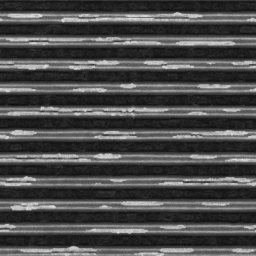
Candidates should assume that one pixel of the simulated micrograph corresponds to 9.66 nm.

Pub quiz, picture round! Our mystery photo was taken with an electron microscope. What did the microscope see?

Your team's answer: parallel lines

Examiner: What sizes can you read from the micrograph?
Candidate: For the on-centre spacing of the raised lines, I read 0.227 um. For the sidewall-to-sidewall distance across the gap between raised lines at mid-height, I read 0.132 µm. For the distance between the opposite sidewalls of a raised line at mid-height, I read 94.2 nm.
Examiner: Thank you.